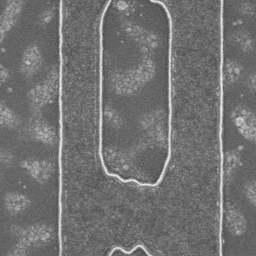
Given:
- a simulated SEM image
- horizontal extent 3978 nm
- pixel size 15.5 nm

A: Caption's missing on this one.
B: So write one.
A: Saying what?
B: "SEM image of one or a few lines or trenches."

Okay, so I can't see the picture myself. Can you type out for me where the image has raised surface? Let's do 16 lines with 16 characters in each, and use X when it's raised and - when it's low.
----XXX---XXXX--
----XX-----XXX--
----XX-----XXX--
----XX-----XXX--
----XX-----XXX--
----XX-----XXX--
----XX-----XXX--
----XX-----XXX--
----XX-----XXX--
----XX-----XXX--
----XXX---XXXX--
----XXXXX-XXXX--
----XXXXXXXXXX--
----XXXXXXXXXX--
----XXXXXXXXXX--
----XXXXXXXXXX--